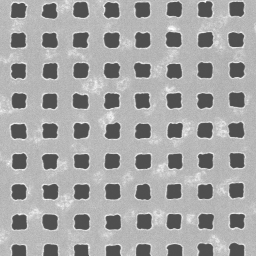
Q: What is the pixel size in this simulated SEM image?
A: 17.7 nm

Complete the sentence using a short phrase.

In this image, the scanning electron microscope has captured a regular array of holes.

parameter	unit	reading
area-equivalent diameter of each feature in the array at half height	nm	289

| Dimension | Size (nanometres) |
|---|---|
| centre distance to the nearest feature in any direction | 530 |